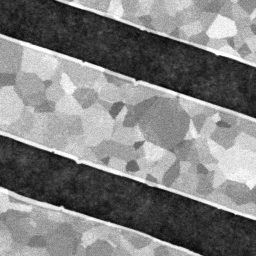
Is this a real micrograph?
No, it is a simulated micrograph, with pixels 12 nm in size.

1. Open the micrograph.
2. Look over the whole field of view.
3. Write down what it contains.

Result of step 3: one or a few lines or trenches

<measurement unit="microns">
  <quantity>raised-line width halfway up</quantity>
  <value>1.13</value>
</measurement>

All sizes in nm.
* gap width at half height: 620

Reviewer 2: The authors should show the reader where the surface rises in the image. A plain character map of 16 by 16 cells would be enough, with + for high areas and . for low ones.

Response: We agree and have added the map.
.....+++++++++++
........++++++++
+..........+++++
++++..........++
+++++++.........
++++++++++......
+++++++++++++...
++++++++++++++++
.+++++++++++++++
....++++++++++++
......++++++++++
..........++++++
++...........+++
+++++..........+
+++++++++.......
+++++++++++.....